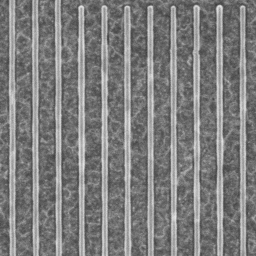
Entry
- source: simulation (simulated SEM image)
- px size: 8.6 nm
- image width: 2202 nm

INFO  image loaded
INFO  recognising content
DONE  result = parallel lines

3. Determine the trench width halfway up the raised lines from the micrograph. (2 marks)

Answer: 155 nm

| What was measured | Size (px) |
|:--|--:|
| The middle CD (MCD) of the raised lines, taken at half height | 5.13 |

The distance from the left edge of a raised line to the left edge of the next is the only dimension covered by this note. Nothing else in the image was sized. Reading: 199 nm